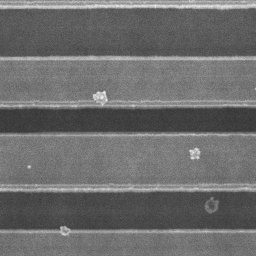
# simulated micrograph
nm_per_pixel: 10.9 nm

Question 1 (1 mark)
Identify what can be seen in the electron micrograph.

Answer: lines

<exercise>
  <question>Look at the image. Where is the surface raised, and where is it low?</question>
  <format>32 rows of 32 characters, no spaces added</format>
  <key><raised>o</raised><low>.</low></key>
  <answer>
oooooooooooooooooooooooooooooooo
................................
................................
................................
................................
................................
................................
oooooooooooooooooooooooooooooooo
oooooooooooooooooooooooooooooooo
oooooooooooooooooooooooooooooooo
oooooooooooooooooooooooooooooooo
oooooooooooooooooooooooooooooooo
oooooooooooooooooooooooooooooooo
................................
................................
................................
................................
oooooooooooooooooooooooooooooooo
oooooooooooooooooooooooooooooooo
oooooooooooooooooooooooooooooooo
oooooooooooooooooooooooooooooooo
oooooooooooooooooooooooooooooooo
oooooooooooooooooooooooooooooooo
oooooooooooooooooooooooooooooooo
................................
................................
................................
................................
................................
oooooooooooooooooooooooooooooooo
oooooooooooooooooooooooooooooooo
oooooooooooooooooooooooooooooooo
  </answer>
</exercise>